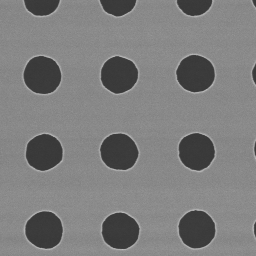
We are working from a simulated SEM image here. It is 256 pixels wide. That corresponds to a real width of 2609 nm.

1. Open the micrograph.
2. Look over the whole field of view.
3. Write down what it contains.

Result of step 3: a regular array of holes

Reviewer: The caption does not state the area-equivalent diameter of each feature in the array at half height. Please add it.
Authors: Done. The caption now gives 378 nm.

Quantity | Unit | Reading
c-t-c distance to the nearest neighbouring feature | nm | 780